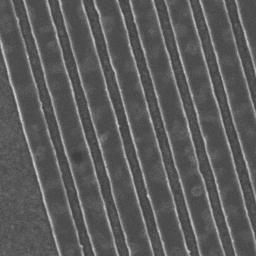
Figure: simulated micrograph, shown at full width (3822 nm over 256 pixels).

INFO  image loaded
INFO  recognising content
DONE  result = parallel lines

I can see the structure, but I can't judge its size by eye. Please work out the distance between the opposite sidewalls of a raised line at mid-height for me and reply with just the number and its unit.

347 nanometers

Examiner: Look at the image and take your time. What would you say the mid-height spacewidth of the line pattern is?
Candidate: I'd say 165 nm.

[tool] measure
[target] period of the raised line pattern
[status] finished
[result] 0.507 µm